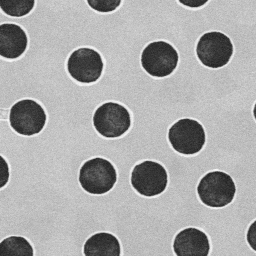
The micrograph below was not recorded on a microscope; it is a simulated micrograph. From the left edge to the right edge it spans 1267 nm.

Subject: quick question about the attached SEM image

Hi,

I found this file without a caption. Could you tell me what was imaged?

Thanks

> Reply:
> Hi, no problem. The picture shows a regular array of holes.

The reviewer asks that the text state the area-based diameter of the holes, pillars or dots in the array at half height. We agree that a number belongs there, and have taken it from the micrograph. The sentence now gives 186 nanometers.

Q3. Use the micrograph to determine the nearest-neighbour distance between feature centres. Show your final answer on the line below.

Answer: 280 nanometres